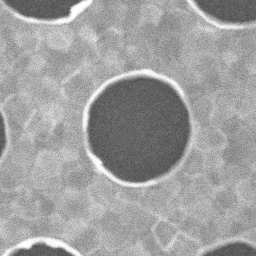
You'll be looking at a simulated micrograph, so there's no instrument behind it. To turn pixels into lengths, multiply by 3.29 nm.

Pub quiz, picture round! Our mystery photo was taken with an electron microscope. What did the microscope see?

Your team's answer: holes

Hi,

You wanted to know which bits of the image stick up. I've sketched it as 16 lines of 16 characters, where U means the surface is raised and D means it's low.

UDDDDUUUUUUUDDDD
UUUUUUUUUUUUUUUU
UUUUUUUUUUUUUUUU
UUUUUUUUUUUUUUUU
UUUUUUUUUUUUUUUU
UUUUUUUDDDDUUUUU
UUUUUUDDDDDDUUUU
UUUUUDDDDDDDUUUU
UUUUUDDDDDDDUUUU
UUUUUUDDDDDDUUUU
UUUUUUUDDDDUUUUU
UUUUUUUUUUUUUUUU
UUUUUUUUUUUUUUUU
UUUUUUUUUUUUUUUU
UUUUUUUUUUUUUUUU
UUDDUUUUUUUUUDDD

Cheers